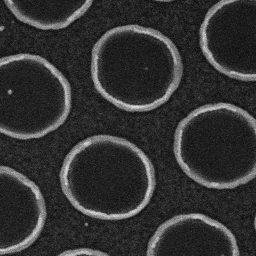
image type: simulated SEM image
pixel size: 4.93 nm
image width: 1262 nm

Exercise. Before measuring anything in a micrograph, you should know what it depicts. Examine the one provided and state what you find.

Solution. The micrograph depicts raised bodies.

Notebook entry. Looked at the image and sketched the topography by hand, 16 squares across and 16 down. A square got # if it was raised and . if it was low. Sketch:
.####.........##
..##.........###
......####...###
......#####..###
###...#####...##
####..#####.....
####...###......
####........####
.#.........#####
.....####..#####
....#####...####
##..#####....##.
##...####.......
###...##........
##........####..
#........######.